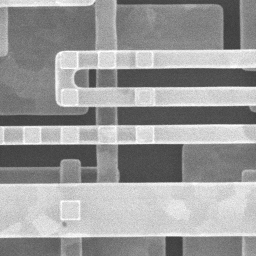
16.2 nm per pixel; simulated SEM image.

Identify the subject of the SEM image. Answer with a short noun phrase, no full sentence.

wiring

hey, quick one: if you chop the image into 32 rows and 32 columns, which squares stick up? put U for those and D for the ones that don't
UUUUUUUUUUUUUUUDDDDDDDDDDDDDDDDD
UDDDDDDDDDDDUUDDDDDDDDDDDDDDDDDD
UDDDDDDDDDDDUUDDDDDDDDDDDDDDDDDD
UDDDDDDDDDDDUUDDDDDDDDDDDDDDDDDD
UDDDDDDDDDDDUUUDDDDDDDDDDDDDDDDD
UDDDDDDDDDDDUUUDDDDDDDDDDDDDDDDD
UDDDDDDDUUUUUUUUUUUUUUUUUUUUUUUU
DDDDDDDUUUUUUUUUUUUUUUUUUUUUUUUU
DDDDDDDUUUUUUUUUUUUUUDDDDDDDDDDD
DDDDDDDUUDDDUUUDDDDDDDDDDDDDDDDD
DDDDDDDUUDDDUUUDDDDDDDDDDDDDDDDD
DDDDDDDUUUUUUUUUUUUUUUUUUUUUUUUU
DDDDDDDUUUUUUUUUUUUUUUUUUUUUUUUU
DDDDDDDDDDDDUUUDDDDDDDDDDDDDDDDD
DDDDDDDDDDDDUUUDDDDDDDDDDDDDDDDD
DDDDDDDDDDDDUUUDDDDDDDDDDDDDDDDD
UUUUUUUUUUUUUUUUUUUUUUUUUUUUUUUU
UUUUUUUUUUUUUUUUUUUUUUUUUUUUUUUU
DDDDDDDDDDDDUUUDDDDDDDDDDDDDDDDD
DDDDDDDDDDDDUUUDDDDDDDDDDDDDDDDD
DDDDDDDDUUDDUUUDDDDDDDDDDDDDDDDD
DDDDDDDDUUDDUUUDDDDDDDDDDDDDDDUU
DDDDDDDDUUDDUUUDDDDDDDDDDDDDDDUU
UUUUUUUUUUUUUUUUUUUUUUUUUUUUUUUU
UUUUUUUUUUUUUUUUUUUUUUUUUUUUUUUU
UUUUUUUUUUUUUUUUUUUUUUUUUUUUUUUU
UUUUUUUUUUUUUUUUUUUUUUUUUUUUUUUU
UUUUUUUUUUUUUUUUUUUUUUUUUUUUUUUU
UUUUUUUUUUUUUUUUUUUUUUUUUUUUUUUU
UUUUUUUUUUUUUUUUUUDDDDDDDDDDDDUU
DDDDDDDDUUDDDDDDDDDDDDDDDDDDDDUU
DDDDDDDDUUDDDDDDDDDDDDDDDDDDDDUU